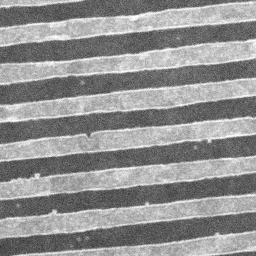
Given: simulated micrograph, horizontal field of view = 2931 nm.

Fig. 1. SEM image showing parallel lines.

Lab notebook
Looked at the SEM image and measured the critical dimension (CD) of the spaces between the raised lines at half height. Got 241 nanometres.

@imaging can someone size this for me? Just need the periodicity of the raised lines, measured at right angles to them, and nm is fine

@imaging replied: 438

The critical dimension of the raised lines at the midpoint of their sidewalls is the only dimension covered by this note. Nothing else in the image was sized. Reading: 201 nm